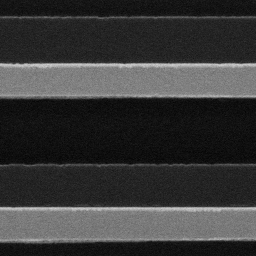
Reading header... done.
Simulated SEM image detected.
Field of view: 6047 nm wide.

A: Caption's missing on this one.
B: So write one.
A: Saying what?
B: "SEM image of lines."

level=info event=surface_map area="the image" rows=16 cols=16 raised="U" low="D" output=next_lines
DDDDDDDDDDDDDDDD
UUUUUUUUUUUUUUUU
UUUUUUUUUUUUUUUU
UUUUUUUUUUUUUUUU
UUUUUUUUUUUUUUUU
UUUUUUUUUUUUUUUU
DDDDDDDDDDDDDDDD
DDDDDDDDDDDDDDDD
DDDDDDDDDDDDDDDD
DDDDDDDDDDDDDDDD
UUUUUUUUUUUUUUUU
UUUUUUUUUUUUUUUU
UUUUUUUUUUUUUUUU
UUUUUUUUUUUUUUUU
UUUUUUUUUUUUUUUU
DDDDDDDDDDDDDDDD